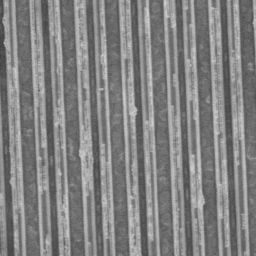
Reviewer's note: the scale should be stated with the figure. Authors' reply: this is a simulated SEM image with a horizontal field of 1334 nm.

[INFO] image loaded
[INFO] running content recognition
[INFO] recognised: parallel lines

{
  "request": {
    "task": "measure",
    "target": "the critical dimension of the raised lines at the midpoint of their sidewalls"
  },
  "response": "48.2 nm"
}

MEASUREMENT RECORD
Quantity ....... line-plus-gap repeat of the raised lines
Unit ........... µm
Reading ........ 0.117